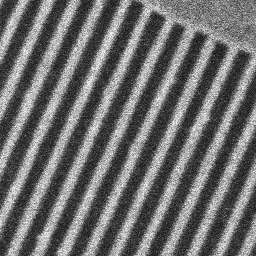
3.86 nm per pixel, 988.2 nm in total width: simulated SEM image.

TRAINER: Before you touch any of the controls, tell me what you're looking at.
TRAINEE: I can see parallel lines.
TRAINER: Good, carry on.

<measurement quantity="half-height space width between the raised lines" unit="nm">51.9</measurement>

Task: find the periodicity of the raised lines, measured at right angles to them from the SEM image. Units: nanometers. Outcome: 90.8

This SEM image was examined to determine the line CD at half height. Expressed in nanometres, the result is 38.6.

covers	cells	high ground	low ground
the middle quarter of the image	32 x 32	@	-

@@@----@@@---@@@----@@----@@@---
@@@---@@@----@@@---@@@----@@----
@@----@@@---@@@----@@@---@@@----
@@----@@----@@@---@@@----@@@---@
@----@@@----@@----@@@----@@----@
@----@@----@@@----@@----@@@---@@
----@@@---@@@----@@@----@@----@@
----@@----@@@----@@----@@@---@@@
---@@@----@@----@@@----@@----@@@
---@@----@@@----@@----@@@----@@-
--@@@----@@----@@@----@@----@@@-
--@@@---@@@----@@----@@@----@@@-
-@@@----@@----@@@----@@----@@@--
-@@@---@@@----@@@----@@----@@@--
-@@----@@----@@@----@@@----@@---
@@@----@@----@@@---@@@----@@@---
@@----@@@----@@----@@-----@@----
@@----@@----@@@----@@----@@@---@
@----@@@----@@----@@@----@@----@
@----@@----@@@---@@@----@@@----@
----@@@----@@----@@@----@@----@@
----@@----@@@---@@@----@@@----@@
----@@----@@----@@@----@@----@@@
---@@@---@@@----@@----@@@----@@-
--@@@----@@@---@@@----@@@---@@@-
--@@@---@@@----@@@---@@@----@@--
--@@----@@@---@@@----@@@---@@@--
-@@@----@@----@@@---@@@----@@@--
-@@----@@@----@@----@@@---@@@---
@@@----@@----@@@----@@----@@@---
@@----@@@----@@----@@@----@@----
@@----@@----@@@----@@----@@@----